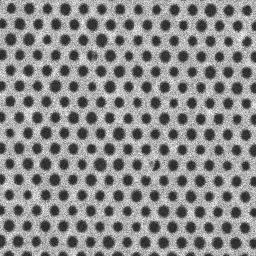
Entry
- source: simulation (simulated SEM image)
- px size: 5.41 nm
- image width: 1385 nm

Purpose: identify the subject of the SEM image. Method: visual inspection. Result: a regular array of holes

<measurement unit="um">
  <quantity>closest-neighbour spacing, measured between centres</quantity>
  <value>0.0959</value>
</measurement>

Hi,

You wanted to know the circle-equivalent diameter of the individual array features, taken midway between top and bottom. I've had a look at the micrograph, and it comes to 57.6 nm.